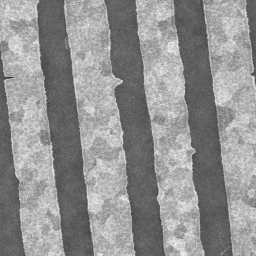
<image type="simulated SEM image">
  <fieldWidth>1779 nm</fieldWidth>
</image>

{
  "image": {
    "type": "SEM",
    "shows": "one or a few lines or trenches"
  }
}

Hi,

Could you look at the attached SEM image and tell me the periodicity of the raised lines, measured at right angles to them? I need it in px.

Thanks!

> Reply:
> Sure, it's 69.5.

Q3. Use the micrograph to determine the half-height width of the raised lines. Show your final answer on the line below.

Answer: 270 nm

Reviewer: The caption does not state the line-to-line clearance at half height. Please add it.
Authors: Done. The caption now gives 211 nm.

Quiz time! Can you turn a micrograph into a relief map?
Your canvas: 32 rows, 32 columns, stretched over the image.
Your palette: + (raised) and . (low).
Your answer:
+++++...+++++....+++++...++++++.
+++++...+++++....+++++....+++++.
+++++...+++++....+++++....+++++.
+++++...++++++...+++++....+++++.
+++++...++++++...+++++....+++++.
+++++....+++++...+++++....+++++.
+++++....+++++....++++....+++++.
+++++....+++++....+++++...++++++
+++++....+++++....+++++...++++++
.++++....+++++....+++++....++++.
.++++....++++++...+++++....+++++
.+++++...+++++....+++++....+++++
.+++++....++++....+++++....+++++
.+++++....+++++....++++....+++++
.+++++....+++++....++++....+++++
.+++++....+++++....++++....+++++
.+++++....+++++....+++++...+++++
..++++....+++++....+++++....++++
..++++....+++++....+++++....++++
..+++++...++++++...+++++....++++
..+++++...++++++...+++++....++++
..+++++....+++++...+++++....++++
..+++++....+++++....++++....++++
..+++++....+++++....++++....++++
..+++++....+++++....+++++...++++
...++++....+++++....+++++....+++
...++++....+++++....+++++....+++
...+++++...+++++....+++++....+++
...+++++...+++++....+++++....+++
...+++++...+++++....+++++....+++
...+++++....+++++...+++++....+++
...+++++....+++++....++++....+++